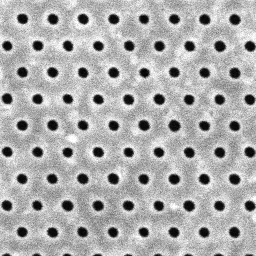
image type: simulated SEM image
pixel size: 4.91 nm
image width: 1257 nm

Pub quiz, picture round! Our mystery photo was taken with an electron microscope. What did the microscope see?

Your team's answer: a regular array of holes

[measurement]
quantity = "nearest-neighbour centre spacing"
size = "148 nm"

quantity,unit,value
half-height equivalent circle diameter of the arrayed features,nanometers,52